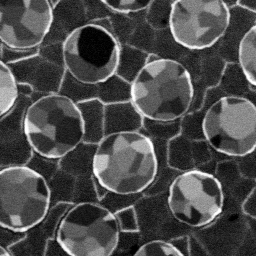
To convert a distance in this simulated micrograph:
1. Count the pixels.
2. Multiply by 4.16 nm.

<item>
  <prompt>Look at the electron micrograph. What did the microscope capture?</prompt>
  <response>raised bodies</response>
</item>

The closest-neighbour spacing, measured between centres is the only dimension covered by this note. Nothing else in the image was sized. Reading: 332 nanometres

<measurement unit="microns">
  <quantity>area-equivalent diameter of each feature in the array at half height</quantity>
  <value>0.252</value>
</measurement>